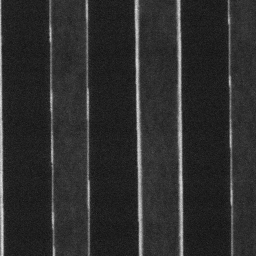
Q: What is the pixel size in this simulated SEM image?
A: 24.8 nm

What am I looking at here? lines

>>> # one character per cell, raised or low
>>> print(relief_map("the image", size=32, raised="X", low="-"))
------XXXXX------XXXXX-------XXX
------XXXXX------XXXXX-------XXX
------XXXXX------XXXXX-------XXX
------XXXXX------XXXXX-------XXX
------XXXXX------XXXXX-------XXX
------XXXXX------XXXXX-------XXX
------XXXXX------XXXXX-------XXX
------XXXXX------XXXXX-------XXX
------XXXXX------XXXXX-------XXX
------XXXXX------XXXXX-------XXX
------XXXXX------XXXXX-------XXX
------XXXXX------XXXXX-------XXX
------XXXXX------XXXXX-------XXX
------XXXXX------XXXXX-------XXX
------XXXXX------XXXXX-------XXX
------XXXXX------XXXXX-------XXX
------XXXXX------XXXXX-------XXX
------XXXXX------XXXXXX------XXX
------XXXXX------XXXXXX------XXX
------XXXXX------XXXXXX------XXX
-------XXXX------XXXXXX------XXX
-------XXXX------XXXXXX------XXX
-------XXXX------XXXXXX------XXX
-------XXXX------XXXXXX------XXX
-------XXXX------XXXXXX------XXX
-------XXXX-------XXXXX------XXX
-------XXXX-------XXXXX------XXX
-------XXXX-------XXXXX------XXX
-------XXXX-------XXXXX------XXX
-------XXXX-------XXXXX------XXX
-------XXXX-------XXXXX------XXX
-------XXXX-------XXXXX------XXX